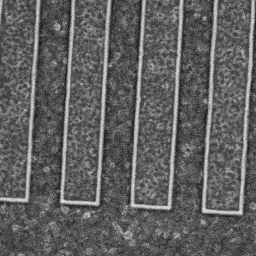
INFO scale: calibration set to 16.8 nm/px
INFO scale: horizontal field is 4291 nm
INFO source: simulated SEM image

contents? one or a few lines or trenches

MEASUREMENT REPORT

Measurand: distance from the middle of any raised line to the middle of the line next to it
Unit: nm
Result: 1190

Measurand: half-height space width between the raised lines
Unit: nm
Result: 581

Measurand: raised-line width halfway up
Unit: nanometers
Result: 632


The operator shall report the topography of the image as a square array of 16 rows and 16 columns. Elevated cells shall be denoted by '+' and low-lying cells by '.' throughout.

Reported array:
++...++..++..+++
++...++..++..+++
++..+++..++..+++
++..+++..++..+++
++..+++..++..+++
++..++...++..+++
++..++...++..++.
++..++...++..++.
++..++..+++..++.
++..++..+++..++.
++..++..+++..++.
++..++..+++..++.
....++..+++..++.
................
................
................